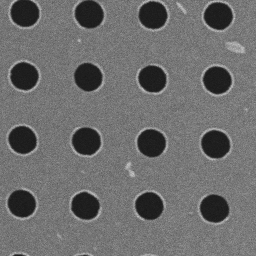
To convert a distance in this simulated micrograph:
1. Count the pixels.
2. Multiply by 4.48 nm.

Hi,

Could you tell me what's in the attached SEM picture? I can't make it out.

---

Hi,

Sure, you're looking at a regular array of holes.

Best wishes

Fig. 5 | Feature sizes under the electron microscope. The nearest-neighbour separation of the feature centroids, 285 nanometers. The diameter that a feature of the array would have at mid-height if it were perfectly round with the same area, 124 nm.